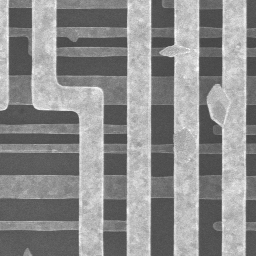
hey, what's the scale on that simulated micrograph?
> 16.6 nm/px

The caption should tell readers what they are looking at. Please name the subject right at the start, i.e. wiring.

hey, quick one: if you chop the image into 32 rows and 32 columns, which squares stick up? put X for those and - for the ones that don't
X---XXX---------XXX---XXX---XXX-
X---XXX---------XXX---XXX---XXX-
X---XXX---------XXX---XXX---XXX-
X---XXX---------XXX---XXX---XXX-
X---XXX---------XXX---XXX---XXX-
X---XXX---------XXX---XXX---XXX-
X---XXX---------XXX-XXXXX---XXX-
X---XXX---------XXX---XXX---XXX-
X---XXX---------XXX---XXX---XXX-
X---XXX---------XXX---XXX---XXX-
X---XXX---------XXX---XXX---XXX-
X---XXXXXXXXX---XXX---XXX-XXXXX-
X---XXXXXXXXX---XXX---XXX-XXXXX-
X----XXXXXXXX---XXX---XXX-XXXXX-
----------XXX---XXX---XXX-XXXXX-
----------XXX---XXX---XXX--XXXX-
----------XXX---XXX---XXX---XXX-
----------XXX---XXX---XXX---XXX-
----------XXX---XXX---XXX---XXX-
----------XXX---XXX---XXX---XXX-
----------XXX---XXX---XXX---XXX-
----------XXX---XXX---XXX---XXX-
----------XXX---XXX---XXX---XXX-
----------XXX---XXX---XXX---XXX-
----------XXX---XXX---XXX---XXX-
----------XXX---XXX---XXX---XXX-
----------XXX---XXX---XXX---XXX-
----------XXX---XXX---XXX---XXX-
----------XXX---XXX---XXX---XXX-
----------XXX---XXX---XXX---XXX-
----------XXX---XXX---XXX---XXX-
----------XXX---XXX---XXX---XXX-